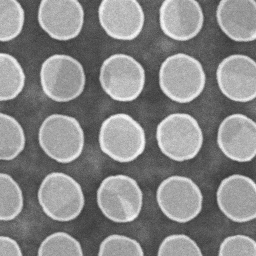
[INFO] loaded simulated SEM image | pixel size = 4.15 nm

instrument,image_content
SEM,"a regular array of raised bodies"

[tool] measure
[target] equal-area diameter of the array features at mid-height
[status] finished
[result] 183 nanometers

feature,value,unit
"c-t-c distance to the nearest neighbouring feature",0.245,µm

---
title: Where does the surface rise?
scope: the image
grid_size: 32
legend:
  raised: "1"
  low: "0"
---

11000111110001111000011110001111
11100111110001111100111110011111
11100111110001111100111110011111
11100111110001111100111110001111
11000001100000111000011100000111
00000000000000000000000000000000
00000000000000000000000000000000
11000011100001111000011100001110
11000111110001111100111110011111
11100111110001111100111110011111
11100111110001111100111110011111
11000011110001111000011110001111
00000001100000010000001100000010
00000000000000000000000000000000
10000000000000010000011000000100
11000111110001111000111100001111
11100111110001111100111110011111
11100111110001111100111110011111
11100111110001111100111110001111
11000011110000111000011100001111
00000000000000000000000000000000
00000000000000000000000000000000
11000011100001110000011000001110
11000111110001111000111110001111
11100111110011111100111110011111
11100111110011111100111110011111
11000011110001111000011110001111
00000000000000110000001000000010
00000000000000000000000000000000
00000011100000000000000000000000
11000111110001111000111100001111
11000111110001111100111110001111